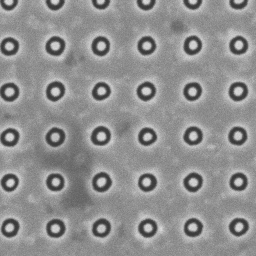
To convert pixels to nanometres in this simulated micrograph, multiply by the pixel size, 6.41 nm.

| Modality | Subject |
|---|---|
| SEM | a regular array of ring-shaped grooves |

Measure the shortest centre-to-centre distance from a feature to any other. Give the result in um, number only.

0.289